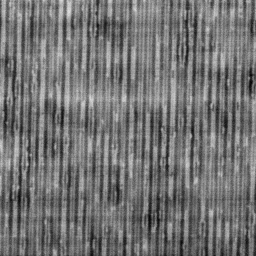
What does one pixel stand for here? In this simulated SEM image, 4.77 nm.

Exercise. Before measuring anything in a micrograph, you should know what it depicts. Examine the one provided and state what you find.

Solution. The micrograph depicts parallel lines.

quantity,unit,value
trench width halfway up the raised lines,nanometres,20.9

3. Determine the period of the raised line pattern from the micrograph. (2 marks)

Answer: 8.18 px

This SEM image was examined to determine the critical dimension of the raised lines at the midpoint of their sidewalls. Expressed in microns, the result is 0.0167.